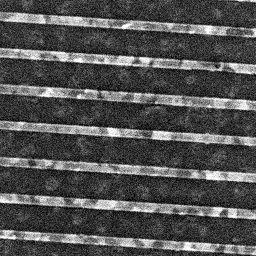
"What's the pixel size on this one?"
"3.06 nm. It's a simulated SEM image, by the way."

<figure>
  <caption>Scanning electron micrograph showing parallel lines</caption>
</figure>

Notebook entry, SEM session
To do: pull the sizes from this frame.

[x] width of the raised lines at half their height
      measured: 23.7 nanometres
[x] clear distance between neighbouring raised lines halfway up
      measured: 85.8 nm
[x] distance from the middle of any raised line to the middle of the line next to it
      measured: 111 nanometers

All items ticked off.